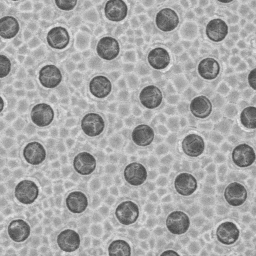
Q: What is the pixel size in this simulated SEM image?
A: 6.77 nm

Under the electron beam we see a regular array of holes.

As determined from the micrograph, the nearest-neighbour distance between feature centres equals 0.266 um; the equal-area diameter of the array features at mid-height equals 159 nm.